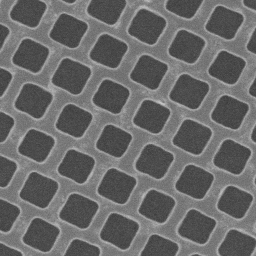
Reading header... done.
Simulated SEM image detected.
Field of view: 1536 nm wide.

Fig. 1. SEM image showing a regular array of holes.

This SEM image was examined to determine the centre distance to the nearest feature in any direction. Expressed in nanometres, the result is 268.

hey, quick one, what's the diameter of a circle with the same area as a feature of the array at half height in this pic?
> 0.201 microns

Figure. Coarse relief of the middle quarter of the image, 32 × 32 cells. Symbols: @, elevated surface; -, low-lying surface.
------@@@@----@@@@--------@@@@@@
-------@@@@@@@@@@---------@@@@@@
-------@@@@@@@@@@--------@@@@@-@
------@@@@@@@@@@@--------@@@@---
------@@@----@@@@@------@@@@----
-----@@@@------@@@@@----@@@-----
-----@@@--------@@@@@@@@@@@-----
@@--@@@@--------@@@@@@@@@@------
@@@@@@@---------@@@@@@@@@@------
@@@@@@@---------@@@@---@@@@@----
---@@@@@-------@@@@------@@@@@--
-----@@@@@----@@@@@-------@@@@@@
-------@@@@@@@@@@@---------@@@@@
-------@@@@@@@@@@---------@@@@@@
-------@@@@@@@@@@---------@@@@--
------@@@@---@@@@@-------@@@@---
------@@@@-----@@@@@----@@@@@---
@----@@@@-------@@@@@@@@@@@@----
@@@@@@@@@--------@@@@@@@@@@-----
@@@@@@@@---------@@@@@@@@@@-----
@@@@@@@@--------@@@@---@@@@@----
@--@@@@@@-------@@@@-----@@@@@--
-----@@@@@@----@@@@--------@@@@@
-------@@@@@@@@@@@@---------@@@@
--------@@@@@@@@@@---------@@@@@
--------@@@@@@@@@@---------@@@@-
-------@@@@---@@@@--------@@@@--
------@@@@------@@@@@-----@@@---
@-----@@@@--------@@@@@--@@@@---
@@@--@@@@---------@@@@@@@@@@----
@@@@@@@@@---------@@@@@@@@@@----
@@@@@@@@---------@@@@@-@@@@@----